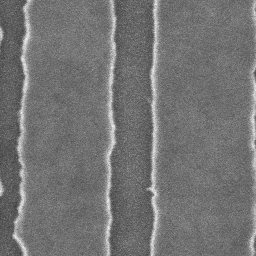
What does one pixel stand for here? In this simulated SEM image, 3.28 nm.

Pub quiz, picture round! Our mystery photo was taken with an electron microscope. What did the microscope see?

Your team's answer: one or a few lines or trenches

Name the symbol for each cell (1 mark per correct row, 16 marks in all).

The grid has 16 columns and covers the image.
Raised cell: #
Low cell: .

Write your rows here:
..#####...######
..#####...######
..#####...######
.######...######
..#####...######
..#####...######
.######...######
.######...######
.######...######
.######...######
.######...######
.######...######
.######...######
.######...######
.######...######
.######...######